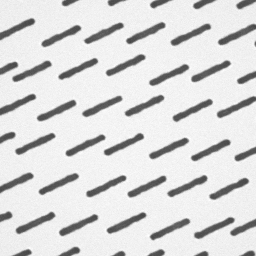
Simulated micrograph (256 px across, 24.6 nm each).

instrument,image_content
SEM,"a regular array of holes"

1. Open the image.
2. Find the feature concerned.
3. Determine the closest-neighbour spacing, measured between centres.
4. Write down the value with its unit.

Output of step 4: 1010 nm